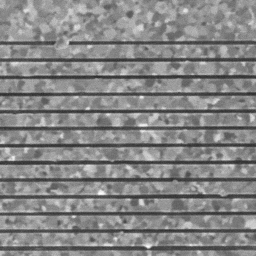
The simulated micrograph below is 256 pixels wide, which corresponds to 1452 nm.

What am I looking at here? parallel lines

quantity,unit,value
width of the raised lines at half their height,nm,71.6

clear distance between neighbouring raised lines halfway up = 22 nm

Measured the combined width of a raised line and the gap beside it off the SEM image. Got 96.9 nm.